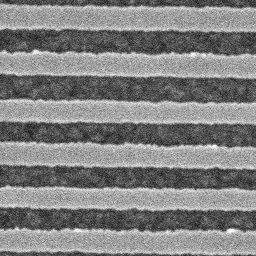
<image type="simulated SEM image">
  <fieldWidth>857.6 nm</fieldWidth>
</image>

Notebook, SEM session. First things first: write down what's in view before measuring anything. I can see lines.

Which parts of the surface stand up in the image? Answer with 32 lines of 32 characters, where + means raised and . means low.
................................
++++++++++++++++++++++++++++++++
++++++++++++++++++++++++++++++++
++++++++++++++++++++++++++++++++
................................
................................
+...++..........................
++++++++++++++++++++++++++++++++
++++++++++++++++++++++++++++++++
.................++..+++++++++++
................................
................................
.+++............................
++++++++++++++++++++++++++++++++
++++++++++++++++++++++++++++++++
...............................+
................................
................................
++++++++++++++++++++++++++++++.+
++++++++++++++++++++++++++++++++
++++++++++++++++++++++++++++++++
................................
................................
++++++++++...++..+..............
++++++++++++++++++++++++++++++++
++++++++++++++++++++++++++++++++
................................
................................
................................
++++++++++++++++++++++++++++++++
++++++++++++++++++++++++++++++++
..+...+...++++++++++++++++++++++